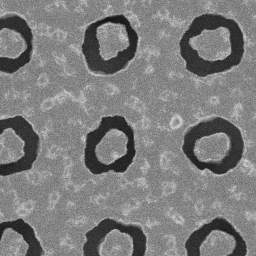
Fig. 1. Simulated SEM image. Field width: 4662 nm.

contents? ring-shaped grooves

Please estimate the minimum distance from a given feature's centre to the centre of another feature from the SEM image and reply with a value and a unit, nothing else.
1790 nanometres